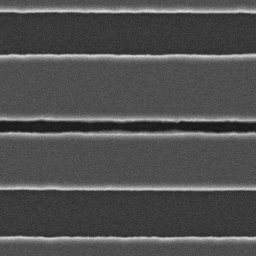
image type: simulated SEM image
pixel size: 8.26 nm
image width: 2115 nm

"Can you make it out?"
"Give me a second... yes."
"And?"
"lines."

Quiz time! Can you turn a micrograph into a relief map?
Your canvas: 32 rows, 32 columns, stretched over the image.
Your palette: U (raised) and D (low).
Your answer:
UUUUUUUUUUUUUUUUUUUUUUUUUUUUUUUU
DDDDDDDDDDDDDDDDDDDDDDDDDDDDDDDD
DDDDDDDDDDDDDDDDDDDDDDDDDDDDDDDD
DDDDDDDDDDDDDDDDDDDDDDDDDDDDDDDD
DDDDDDDDDDDDDDDDDDDDDDDDDDDDDDDD
DDDDDDDDDDDDDDDDDDDDDDDDDDDDDDDD
DDDDDDDDDDDDDDDDDDDDDDDDDDDDDDDD
UUUUUUUUUUUUUUUUUUUUUUUUUUUUUUUU
UUUUUUUUUUUUUUUUUUUUUUUUUUUUUUUU
UUUUUUUUUUUUUUUUUUUUUUUUUUUUUUUU
UUUUUUUUUUUUUUUUUUUUUUUUUUUUUUUU
UUUUUUUUUUUUUUUUUUUUUUUUUUUUUUUU
UUUUUUUUUUUUUUUUUUUUUUUUUUUUUUUU
UUUUUUUUUUUUUUUUUUUUUUUUUUUUUUUU
UUUUUUUUUUUUUUUUUUUUUUUUUUUUUUUU
DDDDDDDDDDDDDDDDDDDDDDDDDDDDDDDD
DDDDDDDDDDDDDDUDDDDDDUUUDDDDDDDD
UUUUUUUUUUUUUUUUUUUUUUUUUUUUUUUU
UUUUUUUUUUUUUUUUUUUUUUUUUUUUUUUU
UUUUUUUUUUUUUUUUUUUUUUUUUUUUUUUU
UUUUUUUUUUUUUUUUUUUUUUUUUUUUUUUU
UUUUUUUUUUUUUUUUUUUUUUUUUUUUUUUU
UUUUUUUUUUUUUUUUUUUUUUUUUUUUUUUU
UUUUUUUUUUUUUUUUUUUUUUUUUUUUUUUU
DDDDDDDDDDDDDDDDDDDDDDDDDDDDDDDD
DDDDDDDDDDDDDDDDDDDDDDDDDDDDDDDD
DDDDDDDDDDDDDDDDDDDDDDDDDDDDDDDD
DDDDDDDDDDDDDDDDDDDDDDDDDDDDDDDD
DDDDDDDDDDDDDDDDDDDDDDDDDDDDDDDD
DDDDDDDDDDDDDDDDDDDDDDDDDDDDDDDD
UUUUUUUUUUUUUUUUUUUUUUUUUUUUUUUU
UUUUUUUUUUUUUUUUUUUUUUUUUUUUUUUU